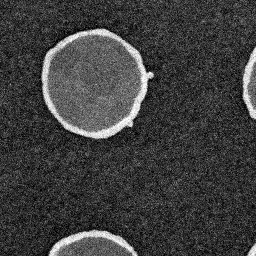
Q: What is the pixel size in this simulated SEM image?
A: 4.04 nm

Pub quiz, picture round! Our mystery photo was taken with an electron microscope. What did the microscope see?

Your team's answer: raised bodies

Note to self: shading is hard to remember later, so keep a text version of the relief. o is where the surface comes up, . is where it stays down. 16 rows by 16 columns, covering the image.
................
................
....oooo........
...oooooo.......
...oooooo......o
...oooooo......o
...oooooo......o
....oooo........
................
................
................
................
................
................
................
...ooooo........